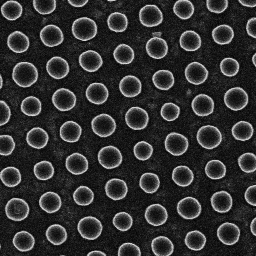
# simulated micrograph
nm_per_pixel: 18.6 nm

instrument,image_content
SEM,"a regular array of raised bodies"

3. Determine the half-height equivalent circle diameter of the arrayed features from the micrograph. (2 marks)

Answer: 384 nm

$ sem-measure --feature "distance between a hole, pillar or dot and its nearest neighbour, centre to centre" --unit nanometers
607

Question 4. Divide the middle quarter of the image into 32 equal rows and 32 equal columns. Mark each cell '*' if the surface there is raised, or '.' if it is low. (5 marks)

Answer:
*...*****......................*
*.....**.......................*
*......................****...**
...............***....*****....*
..............*****....****.....
......****....*****....****.....
*.....*****...*****.............
**....*****....***..............
***...*****.....................
***....***......................
**.......................***....
*...............****....*****...
................*****...*****...
........****....*****....***....
.*.....******...*****...........
****...******...****............
****...******...................
****....****...............**...
****......................****..
...................*.....******.
..................****...******.
.........****.....****....****..
.........*****....****.....**...
.****....*****.....**...........
.*****...*****..................
.*****....***...................
.****.......................***.
....................**.....*****
...................****....*****
...........****....*****....****
...........*****...*****.....*..
...****...******....***.........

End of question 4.